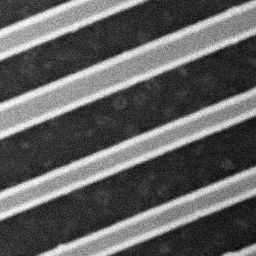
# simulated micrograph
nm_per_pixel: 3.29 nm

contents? one or a few lines or trenches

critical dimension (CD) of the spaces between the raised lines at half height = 176 nm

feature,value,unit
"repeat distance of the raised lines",249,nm